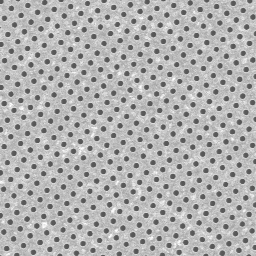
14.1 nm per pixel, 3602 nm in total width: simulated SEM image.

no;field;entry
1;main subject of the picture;a regular array of holes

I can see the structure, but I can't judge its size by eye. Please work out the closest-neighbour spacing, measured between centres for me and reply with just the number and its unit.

163 nanometers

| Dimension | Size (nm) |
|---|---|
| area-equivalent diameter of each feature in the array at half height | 79.4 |